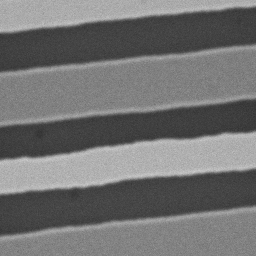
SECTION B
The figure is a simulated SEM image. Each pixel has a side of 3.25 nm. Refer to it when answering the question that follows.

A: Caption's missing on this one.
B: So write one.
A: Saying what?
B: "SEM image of lines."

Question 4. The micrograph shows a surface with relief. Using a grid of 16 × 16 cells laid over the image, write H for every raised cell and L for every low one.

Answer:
HHHHHHHHHHHHHHLL
HHHHHLLLLLLLLLLL
LLLLLLLLLLLLLLLL
LLLLLLLLLHHHHHHH
HHHHHHHHHHHHHHHH
HHHHHHHHHHHHHHHH
HHHHHHHHHHHHHLLL
HHHHLLLLLLLLLLLL
LLLLLLLLLLLLLHHH
LLLLLHHHHHHHHHHH
HHHHHHHHHHHHHHHH
HHHHHHLLLLLLLLLL
LLLLLLLLLLLLLLLL
LLLLLLLLLLLHHHHH
LLHHHHHHHHHHHHHH
HHHHHHHHHHHHHHHH